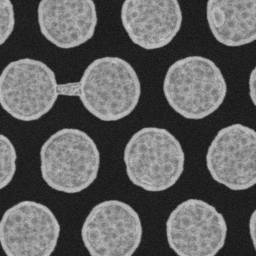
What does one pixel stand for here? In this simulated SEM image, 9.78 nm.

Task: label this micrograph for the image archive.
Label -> raised bodies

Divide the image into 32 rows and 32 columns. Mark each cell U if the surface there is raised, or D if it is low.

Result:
UDDDDUUUUUUDDDDDUUUUUUDDDDUUUUUU
UDDDDUUUUUUUDDDUUUUUUUDDDDUUUUUU
UDDDDUUUUUUUDDDUUUUUUUDDDDUUUUUU
UDDDDUUUUUUUDDDDUUUUUUDDDDDUUUUU
UDDDDDUUUUUDDDDDUUUUUUDDDDDUUUUU
DDDDDDDUUUDDDDDDDDUUDDDDDDDDDDDD
DDDDDDDDDDDDDDDDDDDDDDDDDDDDDDDD
DDDDDDDDDDDDDUUDDDDDDDDUUUDDDDDD
DUUUUUDDDDDUUUUUDDDDDDUUUUUDDDDD
UUUUUUDDDDDUUUUUUDDDDUUUUUUDDDDD
UUUUUUUDDDUUUUUUUDDDDUUUUUUUDDDU
UUUUUUUDDDUUUUUUUDDDDUUUUUUUDDDD
UUUUUUUDDDDUUUUUUDDDDUUUUUUUDDDD
DUUUUUDDDDDUUUUUDDDDDDUUUUUDDDDD
DDUUUDDDDDDDDUUDDDDDDDDDDDDDDDDD
DDDDDDDDDDDDDDDDDDDDDDDDDDDDDDDD
DDDDDDDDUUDDDDDDDDUUUDDDDDDDUUUD
UDDDDDUUUUUDDDDDDUUUUUDDDDDUUUUU
UDDDDUUUUUUUDDDDUUUUUUDDDDUUUUUU
UUDDDUUUUUUUDDDDUUUUUUUDDDUUUUUU
UUDDDUUUUUUUDDDDUUUUUUUDDDUUUUUU
UUDDDDUUUUUUDDDDUUUUUUDDDDDUUUUU
UDDDDDUUUUUDDDDDDUUUUUDDDDDUUUUU
DDDDDDDDUUDDDDDDDDDUDDDDDDDDDDDD
DDDDDDDDDDDDDDDDDDDDDDDDDDDDDDDD
DDDUDDDDDDDDDUUDDDDDDDDUUDDDDDDD
DUUUUUDDDDDDUUUUUDDDDDUUUUUDDDDD
UUUUUUUDDDDUUUUUUDDDDUUUUUUUDDDD
UUUUUUUDDDDUUUUUUDDDDUUUUUUUDDDD
UUUUUUUDDDUUUUUUUDDDDUUUUUUUDDDD
UUUUUUUDDDDUUUUUUDDDDUUUUUUUDDDD
DUUUUUDDDDDDUUUUDDDDDDUUUUUDDDDD